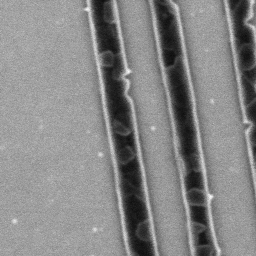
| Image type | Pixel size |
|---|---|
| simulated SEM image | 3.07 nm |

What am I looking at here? one or a few lines or trenches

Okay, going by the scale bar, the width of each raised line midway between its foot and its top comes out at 83.9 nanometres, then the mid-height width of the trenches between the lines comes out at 109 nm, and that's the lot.